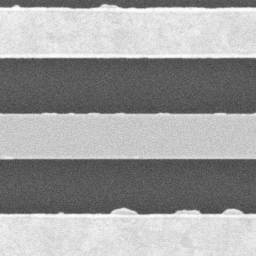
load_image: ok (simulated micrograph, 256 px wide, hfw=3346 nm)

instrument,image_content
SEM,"lines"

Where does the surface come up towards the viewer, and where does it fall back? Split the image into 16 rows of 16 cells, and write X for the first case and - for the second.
----------------
XXXXXXXXXXXXXXXX
XXXXXXXXXXXXXXXX
XXXXXXXXXXXXXXXX
----------------
----------------
----------------
XXXXXXXXXXXXXXXX
XXXXXXXXXXXXXXXX
XXXXXXXXXXXXXXXX
----------------
----------------
----------------
XXXXXXXXXXXXXXXX
XXXXXXXXXXXXXXXX
XXXXXXXXXXXXXXXX